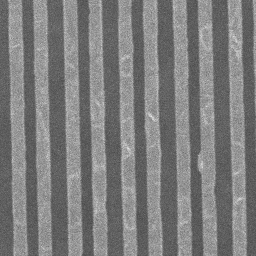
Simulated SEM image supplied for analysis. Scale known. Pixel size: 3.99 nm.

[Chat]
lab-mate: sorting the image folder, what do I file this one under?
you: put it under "parallel lines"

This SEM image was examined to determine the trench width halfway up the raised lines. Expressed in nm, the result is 52.9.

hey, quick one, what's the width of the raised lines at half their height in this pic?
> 49.4 nm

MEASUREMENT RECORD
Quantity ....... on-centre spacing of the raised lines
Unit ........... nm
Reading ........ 110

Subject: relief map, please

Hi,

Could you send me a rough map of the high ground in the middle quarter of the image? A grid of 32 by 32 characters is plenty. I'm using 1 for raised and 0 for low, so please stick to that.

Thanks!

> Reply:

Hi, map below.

11100001100000111000111000001110
01100001110000111000111000001110
01100001110000111000011000001110
01100001110000111000111000001110
01100001110000111000111000001110
01100001110000111000111000001110
01100001110000111000111000001110
01100001110000111000111000001110
01100001110000111000111000001110
01110001110000111000111000001110
01110001110000111000111000001110
01110001110000111000011000001110
01110001110000111000011000001110
01110001110000111000011000001110
01110001110000111000111000001110
01110001110000111000111000001110
01110001110000111000111000001110
01110001110000111000011100001110
01110001110000011000011100001110
01110001110000011000011100001110
01110001110000011000011100001110
01110001110000011000011100001110
01110001110000011000011100001110
01110001110000011000011100001110
01110001110000011000011100001110
01110001110000011100011100000110
01110001110000011100011100000110
01110001110000111100011100000110
01110001110000011100011100000110
01110001110000011100011100000110
01110001110000011100011100000110
01110001110000011100011100000110